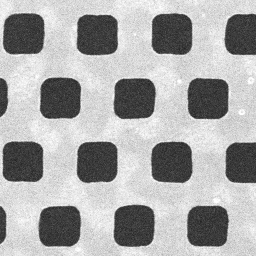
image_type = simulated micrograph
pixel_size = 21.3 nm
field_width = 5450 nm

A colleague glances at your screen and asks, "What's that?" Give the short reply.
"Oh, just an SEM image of a regular array of holes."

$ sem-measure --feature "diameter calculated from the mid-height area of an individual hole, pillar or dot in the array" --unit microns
0.959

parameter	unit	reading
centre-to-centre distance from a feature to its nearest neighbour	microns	1.56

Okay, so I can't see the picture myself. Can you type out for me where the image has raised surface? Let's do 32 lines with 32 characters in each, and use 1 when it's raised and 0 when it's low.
11111111111111111111111111111111
11111111111111111111111111111111
10000111110000011110000011110000
00000011110000011110000011110000
00000011110000011110000011110000
00000111110000011110000011110000
10000111110000111110000011111000
11111111111111111111111111111111
11111111111111111111111111111111
11111111111111111111111111111111
01111000001111000001111100001111
01111000001111000000111000000111
01111000001111000001111000000111
01111000001111000001111100000111
11111000001111100001111100001111
11111111111111111111111111111111
11111111111111111111111111111111
11111111111111111111111111111111
00000111110000011110000011110000
00000111110000011110000011110000
00000111110000011110000011110000
00000111110000011110000011110000
10000111110000111110000011111000
11111111111111111111111111111111
11111111111111111111111111111111
11111111111111111111111111111111
01111000001111000001111100001111
01111000001111000001111000000111
01111000001111000001111000000111
01111000001111000001111000001111
11111000011111100001111100001111
11111111111111111111111111111111